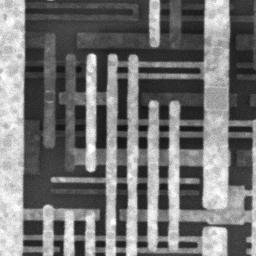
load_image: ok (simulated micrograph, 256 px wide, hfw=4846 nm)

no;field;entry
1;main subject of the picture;wiring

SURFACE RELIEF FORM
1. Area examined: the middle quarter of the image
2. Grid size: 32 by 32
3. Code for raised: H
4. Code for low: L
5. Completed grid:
LHHLLLHHLLLHHLLLHHLLLLLLLLLLLLLL
LHHLLLHHLLLHHLLLHHLLLLLLLLLLLLLL
LHHLLLHHLLLHHLLLHHLLLLLLLLLLLLLL
LHHLLLHHLLLHHLLLHHLLLLLLLLLLLLLL
LHHLLLHHLLLHHLLLHHLLLLLLLLLLLLLL
LHHLLLHHLLLHHLLLHHLLLLLLLLLLLLLL
LHHLLLHHLLLHHLLLHHLLLLLLLLLLLLLL
LHHLLLHHLLLHHLLLHHLLLLLLLLLLLLLL
LHHLLLHHLLLHHLLLHHLLLLLLLLLLLLLL
LHHLLLHHLLLHHLLLHHLLLLHLLLLHLLLL
LHHLLLHHLLLHHLLLHHLLLHHHLLHHHLLL
LHHLLLHHLLLHHLLLHHLLLHHHLLHHHLLL
LHHLLLHHLLLHHLLLHHLLLHHHLLHHHLLL
LHHLLLHHLLLHHLLLHHLLLHHHLLHHHLLL
LHHLLLHHLLLHHLLLHHLLLHHHLLHHHLLL
LHHLLLHHLLLHHLLLHHLLLHHHLLHHHLLL
LHHLLLHHLLLHHLLLHHLLLHHHLLHHHLLL
LHHLLLHHLLLHHLLLHHLLLHHHLLHHHLLL
LHHLLLHHLLLHHLLLHHLLLHHHLLHHHLLL
LHHLLLHHLLLHHLLLHHLLLHHHLLHHHLLL
LHHLLLHHLLLHHLLLHHLLLHHHLLHHHLLL
LHHLLLHHLLLHHLLLHHLLLHHHLLHHHLLL
LHHLLLHHLLLHHLLLHHLLLHHHLLHHHLLL
LHHLLLHHLLLHHLLLHHLLLHHHLLHHHLLL
LHHLLHHHLLLHHLLLHHLLLHHHLLHHHLLL
HHHLLHHHLLLHHLLLHHLLLHHHLLHHHLLL
LHLLLLHHLLLHHLLLHHLLLHHHLLHHHLLL
LLLLLLLLLLLHHLLLHHLLLHHHLLHHHLLL
LLLLLLLLLLLHHLLLHHLLLHHHLLHHHLLL
LLLLLLLLLLLHHLLLHHLLLHHHLLHHHLLL
LLLLLLLLLLLHHLLLHHLLLHHHLLHHHLLL
LLLLLLLLLLLHHLLLHHLLLHHHLLHHHLLL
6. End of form